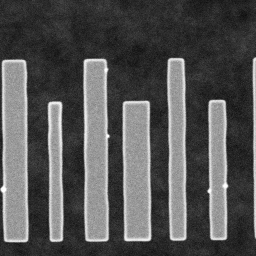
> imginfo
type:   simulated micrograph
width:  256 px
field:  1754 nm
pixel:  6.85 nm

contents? groups of lines, slits or small figures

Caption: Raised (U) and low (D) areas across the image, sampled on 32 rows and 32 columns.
DDDDDDDDDDDDDDDDDDDDDDDDDDDDDDDD
DDDDDDDDDDDDDDDDDDDDDDDDDDDDDDDD
DDDDDDDDDDDDDDDDDDDDDDDDDDDDDDDD
DDDDDDDDDDDDDDDDDDDDDDDDDDDDDDDD
DDDDDDDDDDDDDDDDDDDDDDDDDDDDDDDD
DDDDDDDDDDDDDDDDDDDDDDDDDDDDDDDD
DDDDDDDDDDDDDDDDDDDDDDDDDDDDDDDD
DDDDDDDDDDDUUDDDDDDDDUUDDDDDDDDD
UUUDDDDDDDDUUDDDDDDDDUUDDDDDDDDD
UUUDDDDDDDDUUDDDDDDDDUUDDDDDDDDD
UUUDDDDDDDDUUDDDDDDDDUUDDDDDDDDD
UUUDDDDDDDDUUDDDDDDDDUUDDDDDDDDD
UUUDDDDDDDDUUDDDDDDDDUUDDDDDDDDD
UUUDDDUUDDDUUDDUUUUDDUUDDDUUDDDD
UUUDDDUUDDDUUDDUUUUDDUUDDDUUDDDD
UUUDDDUUDDDUUDDUUUUDDUUDDDUUDDDD
UUUDDDUUDDDUUDDUUUUDDUUDDDUUDDDD
UUUDDDUUDDDUUDDUUUUDDUUDDDUUDDDD
UUUDDDUUDDDUUDDUUUUDDUUDDDUUDDDD
UUUDDDUUDDDUUDDUUUUDDUUDDDUUDDDD
UUUDDDUUDDDUUDDDUUUDDUUDDDUUDDDD
UUUDDDUUDDDUUDDDUUUDDUUDDDUUDDDD
UUUDDDUUDDDUUDDDUUUDDUUDDDUUDDDD
UUUDDDUUDDDUUDDDUUUDDUUDDDUUDDDD
UUUDDDUUDDDUUDDDUUUDDUUDDDUUDDDD
UUUDDDUUDDDUUDDDUUUDDUUDDDUUDDDD
UUUDDDUUDDDUUDDDUUUDDUUDDDUUDDDD
UUUDDDUUDDDUUDDDUUUDDUUDDDUUDDDD
UUUDDDUUDDDUUDDDUUUDDUUDDDUUDDDD
DUUDDDUUDDDUUDDDUUUDDUUDDDUUDDDD
DDDDDDDDDDDDDDDDDDDDDDDDDDDDDDDD
DDDDDDDDDDDDDDDDDDDDDDDDDDDDDDDD